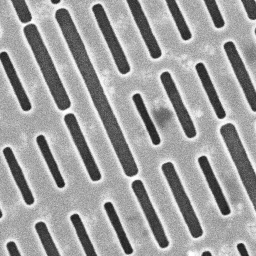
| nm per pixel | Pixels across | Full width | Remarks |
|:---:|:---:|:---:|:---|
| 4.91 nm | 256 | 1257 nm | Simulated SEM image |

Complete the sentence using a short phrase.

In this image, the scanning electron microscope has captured a regular array of holes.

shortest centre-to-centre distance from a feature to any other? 34.8 pixels